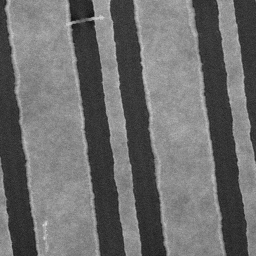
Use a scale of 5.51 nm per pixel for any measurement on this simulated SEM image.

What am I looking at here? lines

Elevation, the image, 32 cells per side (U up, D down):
DUUUUUUUUDDDUUDDDUUUUUUUDDDUUDDD
DUUUUUUUUDDDUUDDDUUUUUUUDDDUUDDD
DUUUUUUUUDDDUUDDDUUUUUUUDDDUUDDD
DUUUUUUUUDDDUUDDDUUUUUUUDDDUUUDD
DUUUUUUUUDDDUUDDDUUUUUUUUDDDUUDD
DUUUUUUUUDDDUUDDDDUUUUUUUDDDUUDD
DDUUUUUUUDDDUUDDDDUUUUUUUDDDUUDD
DDUUUUUUUDDDDUUDDDUUUUUUUDDDUUDD
DDUUUUUUUUDDDUUDDDUUUUUUUDDDUUDD
DDUUUUUUUUDDDUUDDDUUUUUUUDDDUUDD
DDUUUUUUUUDDDUUDDDUUUUUUUDDDUUDD
DDUUUUUUUUDDDUUDDDUUUUUUUDDDDUUD
DDUUUUUUUUDDDUUDDDUUUUUUUDDDDUUD
DDUUUUUUUUDDDUUDDDDUUUUUUUDDDUUD
DDUUUUUUUUDDDUUUDDDUUUUUUUDDDUUD
DDUUUUUUUUDDDDUUDDDUUUUUUUDDDUUD
DDDUUUUUUUUDDDUUDDDUUUUUUUDDDUUD
DDDUUUUUUUUDDDUUDDDUUUUUUUDDDUUD
DDDUUUUUUUUDDDUUDDDUUUUUUUDDDDUU
DDDUUUUUUUUDDDUUDDDUUUUUUUUDDDUU
DDDUUUUUUUUDDDUUDDDDUUUUUUUDDDUU
DDDUUUUUUUUDDDUUDDDDUUUUUUUDDDUU
DDDUUUUUUUUDDDUUDDDDUUUUUUUDDDUU
DDDDUUUUUUUDDDDUUDDDUUUUUUUDDDUU
UDDDUUUUUUUUDDDUUDDDUUUUUUUDDDUU
UDDDUUUUUUUUDDDUUDDDUUUUUUUDDDUU
UDDDUUUUUUUUDDDUUDDDUUUUUUUUDDDU
UDDDUUUUUUUUDDDUUDDDUUUUUUUUDDDU
UDDDUUUUUUUUDDDUUDDDUUUUUUUUDDDU
UDDDUUUUUUUUDDDUUDDDUUUUUUUUDDDU
UDDDDUUUUUUUDDDDUUDDDUUUUUUUDDDU
UUDDDUUUUUUUDDDDUUDDDUUUUUUUDDDU